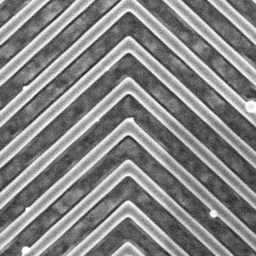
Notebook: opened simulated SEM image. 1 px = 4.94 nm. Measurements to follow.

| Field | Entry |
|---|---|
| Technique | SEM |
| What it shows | groups of lines, slits or small figures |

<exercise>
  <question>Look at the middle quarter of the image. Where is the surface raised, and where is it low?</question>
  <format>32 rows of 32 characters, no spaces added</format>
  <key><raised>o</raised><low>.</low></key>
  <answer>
o.......oooo........ooooo.......
.......oooo..........ooooo......
......oooo............ooooo.....
....ooooo.......o.......oooo....
...oooo.......oooo.......oooo...
..oooo........ooooo.......oooo..
.oooo.......oooooooo.......oooo.
oooo.......oooooooooo.......oooo
ooo.......oooo....oooo.......ooo
oo.......oooo......oooo.......oo
o.......oooo........oooo.......o
.......oooo..........oooo.......
......oooo............oooo......
.....oooo.......o......oooo.....
....oooo.......oo.......ooooo...
...oooo.......oooo.......ooooo..
.ooooo......oooooooo.......oooo.
ooooo.......ooooooooo......ooooo
ooo.......ooooo..ooooo.......ooo
oo.......ooooo.....oooo.......oo
o.......ooooo.......oooo.......o
.......oooo..........oooo.......
......oooo............oooo......
.....oooo..............oooo.....
....oooo.......oo.......oooo....
...oooo.......oooo.......oooo...
..oooo.......oooooo.......oooo..
.oooo.......oooooooo.......ooooo
oooo.......oooo..oooo.......oooo
ooo......ooooo....oooo.......ooo
o........oooo......oooo.......oo
.......oooo.........ooooo.......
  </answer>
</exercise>